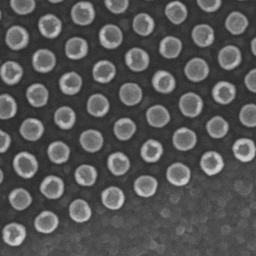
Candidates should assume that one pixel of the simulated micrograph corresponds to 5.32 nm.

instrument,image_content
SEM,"a regular array of raised bodies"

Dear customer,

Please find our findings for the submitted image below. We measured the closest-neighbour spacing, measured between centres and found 185 nanometers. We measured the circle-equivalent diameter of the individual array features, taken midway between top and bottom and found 0.113 microns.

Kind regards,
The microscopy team